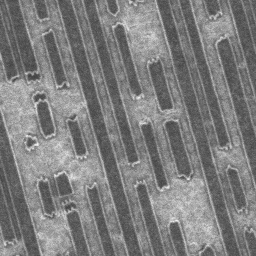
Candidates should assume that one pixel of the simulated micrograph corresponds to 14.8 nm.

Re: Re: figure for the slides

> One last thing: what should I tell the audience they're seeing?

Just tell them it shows parallel lines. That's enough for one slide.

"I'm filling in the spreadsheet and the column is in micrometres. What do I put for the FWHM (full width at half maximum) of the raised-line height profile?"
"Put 0.201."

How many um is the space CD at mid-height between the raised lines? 0.15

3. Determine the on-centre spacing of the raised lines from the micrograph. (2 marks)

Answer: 352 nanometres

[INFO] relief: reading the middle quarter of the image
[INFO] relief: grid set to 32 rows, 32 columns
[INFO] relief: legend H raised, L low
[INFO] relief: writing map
LLLHHHHLLHHHLLLHHHLLLHHHHLLHHHHL
LLLHHHHLLHHHHLLHHHLLLHHHHLLHHHHL
LLLHHHHLLLHHHLLHHHLLLHHHHLLLHHHH
HLLHHHHLLLHHHLLLHHHLLLHHHHLLHHHH
HLLLHHHHLLHHHLLLHHHLLLHHHHLLHHHH
LLLLHHHHLLHHHHLLHHHLLLHHHHLLLHHH
LLLLHHHHLLLHHHLLHHHHLLHHHHLLLHHH
LLLLLHHHLLLHHHLLLHHHLLLHHHHLLHHH
LLLLLHHHHLLHHHHLLLLLLLLHHHHLLLHH
LLLLLHHHHLLLHHHLLLLLLLLHHHHLLLHH
LLLLLHHHHLLLHHHLLLLLLLLLHHHLLLHH
LLLLLLHHHHLLHHHLLLLLLLLLHHHLLLHH
LLLLLLHHHHLLHHHHLLLLLLLLLLLLLLLH
LLLLLLHHHHLLLHHHLLLLLLLLLLLLLLLH
LHHHLLLHHHHLLHHHLLLLLHLLLHHHHLLH
LHHHLLLHHHHLLHHHHLLHHHLLLHHHHLLL
LHHHLLLHHHHLLLHHHLLHHHHLLHHHHLLL
LHHHLLLHHHHLLLHHHLLLHHHLLLHHHLLL
LLHHHLLLHHHHLLHHHLLLHHHLLLHHHHLL
LLHHHLLLHHHHLLHHHHLLHHHLLLHHHHLL
LLHHHLLLHHHHLLLHHHLLHHHLLLHHHHLL
LLLHHHLLLHHHLLLHHHLLLHHHLLLHHHHL
LLLHHHLLLHHHHLLHHHLLLHHHLLLHHHHL
LLLLLLLLLHHHHLLLHHHLLHHHLLLHHHHL
LLLLLLLLLHHHHLLLHHHLLLHHHLLLHHHL
LLLLLLLLLLHHHHLLLLLLLLHHHLLLHHHH
LLLLLLLLLLHHHHLLLLLLLLHHHLLLHHHH
HLLLLLLLLLHHHHLLLLLLLLHHHLLLHHHH
HLLLLLLLLLHHHHLLLLLLLLLHHHLLLLLH
HHLLLLLLLLLHHHHLLLLLLLLHHHLLLLLL
HHLLLLLHLLLHHHHLLLHHHLLHHHLLLLLL
HHLLLLHHHLLHHHHLLLHHHLLLLLLLLLLL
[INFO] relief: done